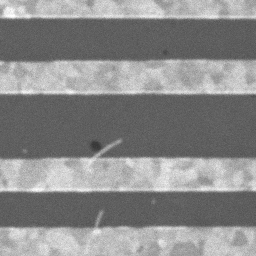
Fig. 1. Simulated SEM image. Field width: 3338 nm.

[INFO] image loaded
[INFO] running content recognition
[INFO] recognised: lines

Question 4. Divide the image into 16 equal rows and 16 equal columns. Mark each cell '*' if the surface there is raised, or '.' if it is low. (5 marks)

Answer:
****************
................
................
................
****************
****************
................
................
................
................
****************
****************
................
................
****************
****************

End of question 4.